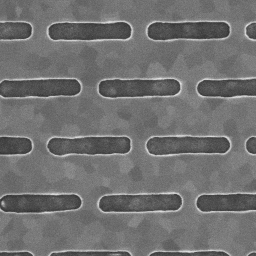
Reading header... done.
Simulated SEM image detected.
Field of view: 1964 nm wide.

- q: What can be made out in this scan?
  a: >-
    holes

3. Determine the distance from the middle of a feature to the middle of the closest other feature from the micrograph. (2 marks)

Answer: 575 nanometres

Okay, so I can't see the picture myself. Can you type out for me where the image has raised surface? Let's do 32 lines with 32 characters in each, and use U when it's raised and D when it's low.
UUUUUUUUUUUUUUUUUUUUUUUUUUUUUUUU
UUUUUUUUUUUUUUUUUUUUUUUUUUUUUUUU
UUUUUUUUUUUUUUUUUUUUUUUUUUUUUUUU
DDDDUUDDDDDDDDDDUUUDDDDDDDDDDUUD
DDDDUUDDDDDDDDDDUUUDDDDDDDDDUUUD
UUUUUUUUUUUUUUUUUUUUUUUUUUUUUUUU
UUUUUUUUUUUUUUUUUUUUUUUUUUUUUUUU
UUUUUUUUUUUUUUUUUUUUUUUUUUUUUUUU
UUUUUUUUUUUUUUUUUUUUUUUUUUUUUUUU
UUUUUUUUUUUUUUUUUUUUUUUUUUUUUUUU
DDDDDDDDDDUUDDDDDDDDDDDUUDDDDDDD
DDDDDDDDDDUUDDDDDDDDDDUUUDDDDDDD
UUUUUUUUUUUUUUUUUUUUUUUUUUUUUUUU
UUUUUUUUUUUUUUUUUUUUUUUUUUUUUUUU
UUUUUUUUUUUUUUUUUUUUUUUUUUUUUUUU
UUUUUUUUUUUUUUUUUUUUUUUUUUUUUUUU
UUUUUUUUUUUUUUUUUUUUUUUUUUUUUUUU
DDDDUUDDDDDDDDDDUUUDDDDDDDDDDUUD
DDDDUUDDDDDDDDDDUUDDDDDDDDDDDUUD
UUUUUUUUUUUUUUUUUUUUUUUUUUUUUUUU
UUUUUUUUUUUUUUUUUUUUUUUUUUUUUUUU
UUUUUUUUUUUUUUUUUUUUUUUUUUUUUUUU
UUUUUUUUUUUUUUUUUUUUUUUUUUUUUUUU
UUUUUUUUUUUUUUUUUUUUUUUUUUUUUUUU
UDDDDDDDDDUUUDDDDDDDDDUUUDDDDDDD
DDDDDDDDDDUUDDDDDDDDDDDUUDDDDDDD
UDDDDDUUUUUUUDDDDDUUUUUUUDDUDDUU
UUUUUUUUUUUUUUUUUUUUUUUUUUUUUUUU
UUUUUUUUUUUUUUUUUUUUUUUUUUUUUUUU
UUUUUUUUUUUUUUUUUUUUUUUUUUUUUUUU
UUUUUUUUUUUUUUUUUUUUUUUUUUUUUUUU
UUUUUUUDDDDDDDDDUUUDDDDDDDDDUUUU